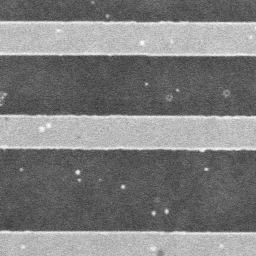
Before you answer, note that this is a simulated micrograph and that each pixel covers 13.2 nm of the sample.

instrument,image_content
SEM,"lines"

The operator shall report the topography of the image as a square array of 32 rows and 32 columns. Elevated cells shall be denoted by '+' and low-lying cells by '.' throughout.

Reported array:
................................
................................
................................
++++++++++++++++++++++++++++++++
++++++++++++++++++++++++++++++++
++++++++++++++++++++++++++++++++
++++++++++++++++++++++++++++++++
................................
................................
................................
................................
................................
................................
................................
+++......+......................
++++++++++++++++++++++++++++++++
++++++++++++++++++++++++++++++++
++++++++++++++++++++++++++++++++
.........+++++++++++++++++++++++
................................
................................
................................
................................
................................
................................
................................
................................
................................
................................
++++++++++++++++++++++++++++++++
++++++++++++++++++++++++++++++++
++++++++++++++++++++++++++++++++